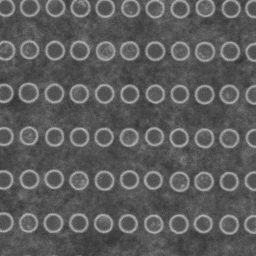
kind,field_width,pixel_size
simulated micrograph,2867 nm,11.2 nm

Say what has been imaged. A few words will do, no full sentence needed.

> a regular array of raised bodies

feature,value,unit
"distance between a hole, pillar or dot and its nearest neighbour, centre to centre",0.277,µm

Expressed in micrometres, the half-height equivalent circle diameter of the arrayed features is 0.202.